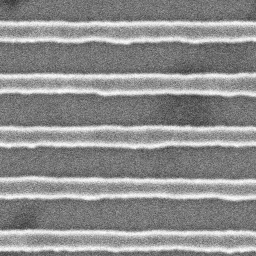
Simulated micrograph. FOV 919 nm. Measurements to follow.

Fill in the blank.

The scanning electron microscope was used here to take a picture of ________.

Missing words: lines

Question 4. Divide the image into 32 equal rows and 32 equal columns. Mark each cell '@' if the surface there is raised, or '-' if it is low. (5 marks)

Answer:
--------------------------------
--------------------------------
--------------------------------
@@@@@@@@@@@@@@@@@@@@@@@@@@@@@@@@
@@@@@@@@@@@@@@@@@@@@@@@@@@@@@@@@
--------------------------------
--------------------------------
--------------------------------
--------------------------------
@@@@@@@@@@@@@@@@@@@@@@@@@@@@@@@@
@@@@@@@@@@@@@@@@@@@@@@@@@@@@@@@@
@-@@@@@@-@@@@@@@@@@@@@@@@@@@@@@@
--------------------------------
--------------------------------
--------------------------------
--------------------------------
@@@@@@@@@@@@@@@@@@@@@@@@@@@@@@@@
@@@@@@@@@@@@@@@@@@@@@@@@@@@@@@@@
--------------------------------
--------------------------------
--------------------------------
--------------------------------
@@@@@@@@@@@@@@@@@@@@-@@---------
@@@@@@@@@@@@@@@@@@@@@@@@@@@@@@@@
@@@@@@@@@@@@@@@@@@@-@@@@@@@@@@@@
--------------------------------
--------------------------------
--------------------------------
--------------------------------
@@@@@@@@@@@@@@@@@@@@@@@@@@@@@@@@
@@@@@@@@@@@@@@@@@@@@@@@@@@@@@@@@
----------------------------@---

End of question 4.